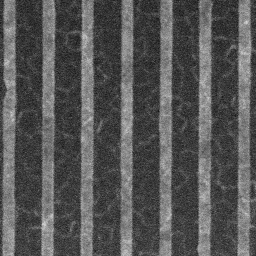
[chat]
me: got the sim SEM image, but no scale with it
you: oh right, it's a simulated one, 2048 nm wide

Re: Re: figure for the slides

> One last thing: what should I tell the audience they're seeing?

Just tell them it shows parallel lines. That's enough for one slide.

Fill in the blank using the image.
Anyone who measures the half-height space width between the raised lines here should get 225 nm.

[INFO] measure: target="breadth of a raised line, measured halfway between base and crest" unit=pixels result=11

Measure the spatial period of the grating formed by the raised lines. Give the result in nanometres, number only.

314